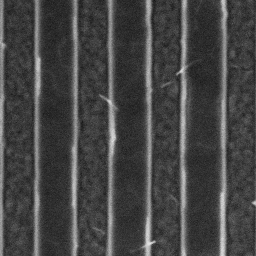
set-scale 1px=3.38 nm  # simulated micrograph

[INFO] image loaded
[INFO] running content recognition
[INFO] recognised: one or a few lines or trenches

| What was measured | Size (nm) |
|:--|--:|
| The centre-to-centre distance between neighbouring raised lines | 249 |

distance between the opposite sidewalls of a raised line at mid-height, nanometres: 137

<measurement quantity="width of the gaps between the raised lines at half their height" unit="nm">113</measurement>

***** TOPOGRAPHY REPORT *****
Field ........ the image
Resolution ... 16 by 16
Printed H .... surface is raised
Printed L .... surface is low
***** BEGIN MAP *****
LLHHHLLHHLLHHHLL
LLHHHLLHHLLHHHLL
LLHHHLLHHLLHHHLL
LLHHHLLHHLLHHHLL
LLHHHLLHHLLHHHLL
LLHHHLLHHLLHHHLL
LLHHHLLHHLLHHHLL
LLHHHLLHHLLHHHLL
LLHHHLLHHLLHHHLL
LLHHHLLHHLLHHHLL
LLHHHLLHHLLHHHLL
LLHHHLLHHLLHHHLL
LLHHHLLHHLLHHHLL
LLHHHLLHHLLHHHLL
LLHHHLLHHLLHHHLL
LLHHHLLHHLLHHHLL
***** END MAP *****